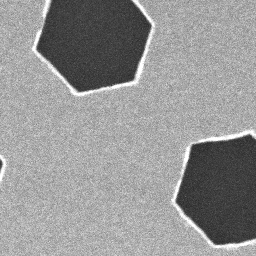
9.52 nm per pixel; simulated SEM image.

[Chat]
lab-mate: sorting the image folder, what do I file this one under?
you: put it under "holes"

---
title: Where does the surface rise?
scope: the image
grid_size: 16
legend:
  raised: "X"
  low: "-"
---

XXX------XXXXXXX
XXX------XXXXXXX
XX-------XXXXXXX
XXX------XXXXXXX
XXXX-----XXXXXXX
XXXXX-XXXXXXXXXX
XXXXXXXXXXXXXXXX
XXXXXXXXXXXXXXXX
XXXXXXXXXXXXXXX-
XXXXXXXXXXXX----
XXXXXXXXXXXX----
XXXXXXXXXXX-----
XXXXXXXXXXX-----
XXXXXXXXXXXX----
XXXXXXXXXXXXX---
XXXXXXXXXXXXXXXX